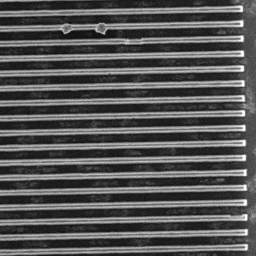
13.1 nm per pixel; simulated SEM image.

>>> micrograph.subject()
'parallel lines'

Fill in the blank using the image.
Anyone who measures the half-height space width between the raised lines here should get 0.135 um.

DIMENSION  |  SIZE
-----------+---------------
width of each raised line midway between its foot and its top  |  57.1 nanometres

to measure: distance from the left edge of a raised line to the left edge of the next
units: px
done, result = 14.9